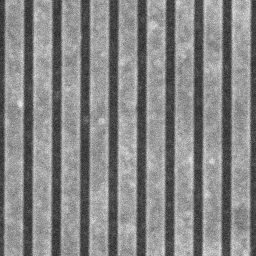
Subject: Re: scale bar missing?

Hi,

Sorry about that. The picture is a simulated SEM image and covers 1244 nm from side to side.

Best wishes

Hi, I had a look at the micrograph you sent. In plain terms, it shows parallel lines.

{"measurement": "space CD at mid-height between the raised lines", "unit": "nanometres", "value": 51.7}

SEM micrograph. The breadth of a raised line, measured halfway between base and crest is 17.8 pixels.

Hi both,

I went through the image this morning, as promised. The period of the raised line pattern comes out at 138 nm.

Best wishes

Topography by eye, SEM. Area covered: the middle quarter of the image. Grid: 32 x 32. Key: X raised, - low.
XXXX---XXXX---XXXX---XXXX---XXXX
XXXX---XXXX---XXXX---XXXX---XXXX
XXXX---XXXX---XXXX---XXXX---XXXX
XXXX---XXXX---XXXX---XXXX---XXXX
XXXX---XXXX---XXXX---XXXX---XXXX
XXXX---XXXX---XXXX---XXXX---XXXX
XXXX---XXXX---XXXX---XXXX---XXXX
XXXX---XXXX---XXXX---XXXX---XXXX
XXXX---XXXX---XXXX---XXXX---XXXX
XXXX---XXXX---XXXX---XXXX---XXXX
XXXX---XXXX---XXXX---XXXX---XXXX
XXXX---XXXX---XXXX---XXXX---XXXX
XXXX---XXXX---XXXX---XXXX---XXXX
XXXX-X-XXXX---XXXX---XXXX---XXXX
XXXX-X-XXXX---XXXX---XXXX---XXXX
XXXX---XXXX---XXXX---XXXX---XXXX
XXXX---XXXX---XXXX---XXXX---XXXX
XX-X---XXXX---XXXX---XXXX---XXXX
XXXX---XXXX---XXXX---XXXX---XXXX
XXXX---XXXX---XXXX---XXXX---XXXX
XXXX---XXXX---XXXX---XXXX---XXXX
XXXX---XXXX---XXXX---XXXX---XXXX
XXXX---XXXX---XXXX---XXXX---XXXX
XXXX---XXXX---XXXX---XXXX---XXXX
XXXX---XXXX---XXXX---XXXX---XXXX
XXXX---XXXX---XXXX---XXXX---XXXX
XXXX---XXXX---XXXX---XXXX---XXXX
XXXX---XXXX---XXXX---XXXX---XXXX
XXXX---XXXX---XXXX---XXXX---XXXX
XXXX---XXXX---XXXX---XXXX---XXXX
XXXX---XXXX---XXXX---XXXX---XXXX
XXXX---XXXX---XXXX---XXXX---XXXX